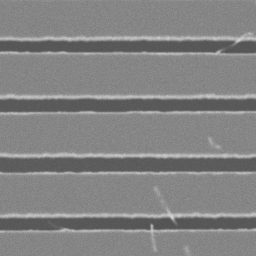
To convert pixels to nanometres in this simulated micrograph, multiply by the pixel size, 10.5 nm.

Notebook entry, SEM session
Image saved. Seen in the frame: lines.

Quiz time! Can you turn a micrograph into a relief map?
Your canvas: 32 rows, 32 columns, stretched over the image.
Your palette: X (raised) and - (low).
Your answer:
XXXXXXXXXXXXXXXXXXXXXXXXXXXXXXXX
XXXXXXXXXXXXXXXXXXXXXXXXXXXXXXXX
XXXXXXXXXXXXXXXXXXXXXXXXXXXXXXXX
XXXXXXXXXXXXXXXXXXXXXXXXXXXXXXXX
XXXXXXXXXXXXXXXXXXXXXXXXXXXXXXXX
--------------------------------
--------------------------------
XXXXXXXXXXXXXXXXXXXXXXXXXXXXXXXX
XXXXXXXXXXXXXXXXXXXXXXXXXXXXXXXX
XXXXXXXXXXXXXXXXXXXXXXXXXXXXXXXX
XXXXXXXXXXXXXXXXXXXXXXXXXXXXXXXX
XXXXXXXXXXXXXXXXXXXXXXXXXXXXXXXX
--------------------------------
--------------------------------
XXXXXXXXXXXXXXXXXXXXXXXXXXXXXXXX
XXXXXXXXXXXXXXXXXXXXXXXXXXXXXXXX
XXXXXXXXXXXXXXXXXXXXXXXXXXXXXXXX
XXXXXXXXXXXXXXXXXXXXXXXXXXXXXXXX
XXXXXXXXXXXXXXXXXXXXXXXXXXXXXXXX
XXXXXXXXXXXXXXXXXXXXXXXXXXXXXXXX
--------------------------------
--------------------------------
XXXXXXXXXXXXXXXXXXXXXXXXXXXXXXXX
XXXXXXXXXXXXXXXXXXXXXXXXXXXXXXXX
XXXXXXXXXXXXXXXXXXXXXXXXXXXXXXXX
XXXXXXXXXXXXXXXXXXXXXXXXXXXXXXXX
XXXXXXXXXXXXXXXXXXXXXXXXXXXXXXXX
--------------------------------
--------------------------------
XXXXXXXXXXXXXXXXXXXXXXXXXXXXXXXX
XXXXXXXXXXXXXXXXXXXXXXXXXXXXXXXX
XXXXXXXXXXXXXXXXXXXXXXXXXXXXXXXX